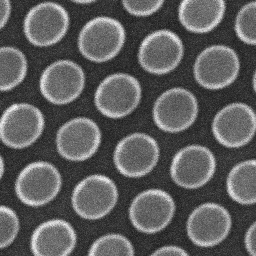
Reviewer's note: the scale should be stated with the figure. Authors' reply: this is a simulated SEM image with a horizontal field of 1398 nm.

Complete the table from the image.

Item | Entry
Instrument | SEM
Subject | a regular array of raised bodies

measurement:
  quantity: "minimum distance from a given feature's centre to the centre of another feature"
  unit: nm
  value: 316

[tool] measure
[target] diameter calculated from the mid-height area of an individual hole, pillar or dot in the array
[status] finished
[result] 0.227 um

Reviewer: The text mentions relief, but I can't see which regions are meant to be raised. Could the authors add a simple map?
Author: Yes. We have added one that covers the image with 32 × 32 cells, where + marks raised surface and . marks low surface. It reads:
+.....+.........++++...+++++....
+...++++........+++....+++++..++
+..+++++....++.........++++...++
...+++++...++++.........++....++
...+++++..+++++....+++........++
....++....+++++...+++++.........
++........+++++...+++++...+++...
+++.........+.....++++...+++++..
+++...++++........+++...++++++..
+++..+++++....++.........++++...
++...+++++...++++........+++....
.....+++++..+++++....++.........
......+++...+++++...++++........
.+++........+++++..++++++...+++.
+++++.........+....+++++...+++++
+++++....+++........++++...+++++
+++++..+++++...............+++++
++++...+++++....+++........++++.
.......+++++...+++++....+.......
........+++...++++++..++++......
....+..........++++...+++++...++
...++++........+++....+++++..+++
..+++++....+++........++++...+++
..+++++...++++...............+++
..+++++..++++++..++++........+++
....+....+++++...+++++..........
+.........+++...++++++..++++....
++...............++++...+++++...
++...++++........+++....+++++..+
++..+++++.....+.........++++...+
+...+++++...++++.........++....+
....+++++..+++++....+++........+